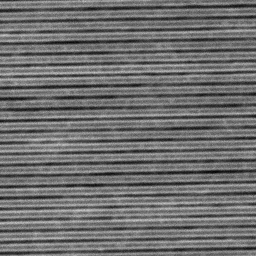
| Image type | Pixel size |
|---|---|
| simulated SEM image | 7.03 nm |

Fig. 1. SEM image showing parallel lines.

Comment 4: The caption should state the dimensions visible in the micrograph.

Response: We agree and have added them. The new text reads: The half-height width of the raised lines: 47.5 nm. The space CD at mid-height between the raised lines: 29.9 nm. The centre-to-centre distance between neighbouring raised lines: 77.5 nm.